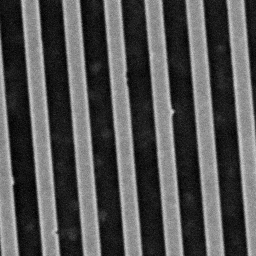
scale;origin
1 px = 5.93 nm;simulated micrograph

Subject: parallel lines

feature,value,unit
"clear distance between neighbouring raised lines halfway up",24.5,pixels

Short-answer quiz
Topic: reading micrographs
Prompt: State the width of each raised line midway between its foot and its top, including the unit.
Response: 0.0982 microns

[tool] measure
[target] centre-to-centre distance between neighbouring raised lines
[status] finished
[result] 243 nanometers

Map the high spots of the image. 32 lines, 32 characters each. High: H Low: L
LLLHHLLLHHLLLHHLLLHHLLLHHLLLHHLL
LLLHHLLLHHLLLHHLLLHHLLLHHLLLLHLL
LLLHHLLLHHLLLHHLLLHHLLLHHHLLLHHL
LLLHHLLLHHLLLHHLLLHHLLLLHHLLLHHL
LLLHHLLLHHLLLHHLLLHHHLLLHHLLLHHL
LLLHHLLLHHLLLLHLLLLHHLLLHHLLLHHL
LLLHHLLLHHLLLLHHLLLHHLLLHHLLLHHL
LLLHHLLLHHLLLLHHLLLHHLLLHHLLLHHL
LLLHHLLLLHHLLLHHLLLHHLLLHHLLLHHL
LLLLHLLLLHHLLLHHLLLHHLLLHHLLLHHL
LLLLHHLLLHHLLLHHLLLHHLLLHHLLLHHL
HLLLHHLLLHHLLLHHLLLHHLLLHHLLLHHL
HLLLHHLLLHHLLLHHLLLHHLLLHHLLLHHH
HLLLHHLLLHHLLLHHLLLHHLLLHHLLLLHH
HLLLHHLLLHHLLLHHLLLHHLLLHHHLLLHH
HLLLHHLLLHHLLLHHLLLHHLLLLHHLLLHH
HLLLHHLLLHHLLLHHLLLLHHLLLHHLLLHH
HLLLHHLLLHHLLLLHLLLLHHLLLHHLLLHH
HLLLHHLLLHHLLLLHHLLLHHLLLHHLLLHH
HLLLHHLLLHHLLLLHHLLLHHLLLHHLLLHH
HLLLHHLLLLHHLLLHHLLLHHLLLHHLLLHH
HLLLLHLLLLHHLLLHHLLLHHLLLHHLLLHH
HHLLLHHLLLHHLLLHHLLLHHLLLHHLLLHH
HHLLLHHLLLHHLLLHHLLLHHLLLHHLLLHH
HHLLLHHLLLHHLLLHHLLLHHLLLHHLLLHH
HHLLLHHLLLHHLLLHHLLLHHLLLHHLLLLH
HHLLLHHLLLHHLLLHHLLLHHLLLHHHLLLH
HHLLLHHLLLHHLLLHHLLLHHLLLLHHLLLH
HHLLLHHLLLHHLLLHHLLLLHHLLLHHLLLH
HHLLLHHLLLHHLLLLHLLLLHHLLLHHLLLH
HHLLLHHLLLHHLLLLHHLLLHHLLLHHLLLH
HHLLLHHLLLHHLLLLHHLLLHHLLLHHLLLH